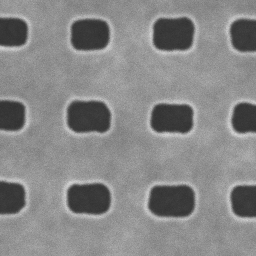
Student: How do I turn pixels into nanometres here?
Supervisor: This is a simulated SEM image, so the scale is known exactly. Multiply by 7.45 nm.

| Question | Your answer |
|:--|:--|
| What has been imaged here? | holes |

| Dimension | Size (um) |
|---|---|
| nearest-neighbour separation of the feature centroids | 0.616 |